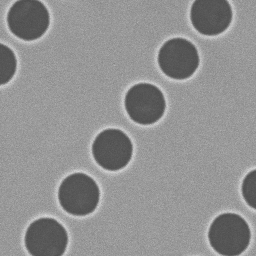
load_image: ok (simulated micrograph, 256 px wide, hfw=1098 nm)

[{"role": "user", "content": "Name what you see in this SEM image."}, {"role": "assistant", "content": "holes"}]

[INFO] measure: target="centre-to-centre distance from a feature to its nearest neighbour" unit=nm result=241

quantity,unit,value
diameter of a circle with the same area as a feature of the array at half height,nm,175